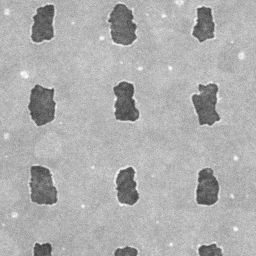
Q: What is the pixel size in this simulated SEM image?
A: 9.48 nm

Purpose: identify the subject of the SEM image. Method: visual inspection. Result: a regular array of holes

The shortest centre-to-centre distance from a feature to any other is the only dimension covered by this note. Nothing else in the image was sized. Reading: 754 nanometres